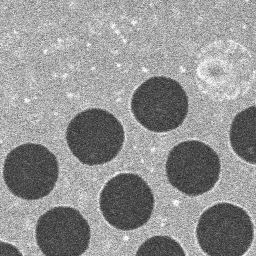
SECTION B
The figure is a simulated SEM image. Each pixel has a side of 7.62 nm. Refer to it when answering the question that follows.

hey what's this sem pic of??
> holes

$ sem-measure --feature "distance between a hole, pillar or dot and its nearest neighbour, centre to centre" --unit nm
552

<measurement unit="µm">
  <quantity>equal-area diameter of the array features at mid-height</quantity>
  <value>0.431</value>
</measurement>